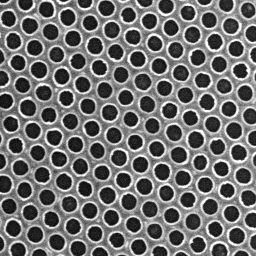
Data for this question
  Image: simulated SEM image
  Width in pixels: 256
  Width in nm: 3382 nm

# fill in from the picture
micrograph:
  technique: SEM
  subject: a regular array of holes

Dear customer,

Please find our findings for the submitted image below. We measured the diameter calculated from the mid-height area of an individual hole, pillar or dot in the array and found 211 nm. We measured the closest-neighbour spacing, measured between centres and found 292 nm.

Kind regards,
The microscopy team